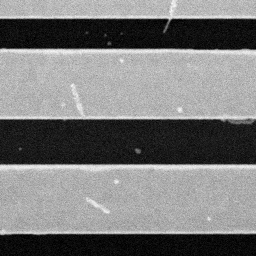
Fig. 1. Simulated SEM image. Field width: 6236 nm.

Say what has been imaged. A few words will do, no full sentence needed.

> lines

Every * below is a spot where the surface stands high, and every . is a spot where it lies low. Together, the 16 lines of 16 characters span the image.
****************
................
................
****************
****************
****************
****************
................
................
................
****************
****************
****************
****************
****************
................